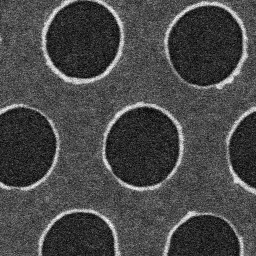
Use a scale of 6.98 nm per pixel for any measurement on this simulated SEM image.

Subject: holes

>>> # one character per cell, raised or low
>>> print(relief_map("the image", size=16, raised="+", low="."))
++++...+++++..++
+++....++++....+
+++.....++.....+
+++....++++....+
++++..+++++....+
++++++++++++++++
++++++++++++++++
...++++....++++.
...++++....+++..
...++++....+++..
...++++....++++.
..++++++..+++++.
++++++++++++++++
++++..++++++.+++
+++....++++....+
+++....++++....+